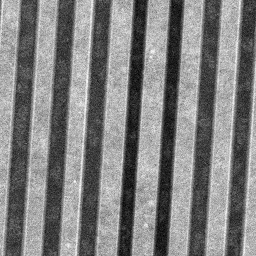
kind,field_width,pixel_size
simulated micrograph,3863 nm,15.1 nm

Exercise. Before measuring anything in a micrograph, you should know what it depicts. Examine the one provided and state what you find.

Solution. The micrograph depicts parallel lines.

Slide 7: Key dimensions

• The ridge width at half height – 0.299 microns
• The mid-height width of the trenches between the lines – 17.2 pixels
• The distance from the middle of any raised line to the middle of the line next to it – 552 nm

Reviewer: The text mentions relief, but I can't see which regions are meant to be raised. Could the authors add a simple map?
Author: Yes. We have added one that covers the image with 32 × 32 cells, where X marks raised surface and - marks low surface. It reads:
XX---XX--XXX--XXX--XX--XX---XX--
XX---XX--XXX--XXX-XXX--XX---XX--
XX---XX--XXX--XXX-XXX--XX---XX--
XX---XX--XX---XXX-XXX--XX---XX--
XX---XX--XX---XX--XXX--XX--XXX--
XX---XX--XX---XX--XXX--XX--XXX--
XX---XX--XX---XX--XXX--XX--XXX--
XX--XXX--XX---XX--XXX--XX--XXX--
XX--XXX--XX--XXX--XXX--XX--XXX--
XX--XXX--XX--XXX--XXX-XXX--XXX--
XX--XX---XX--XXX--XXX-XXX--XX---
XX--XX---XX--XXX--XX--XXX--XX---
XX--XX---XX--XXX--XX--XXX--XX---
XX--XX---XX--XXX--XX--XXX--XX---
XX--XX---XX--XXX--XX--XXX--XX--X
XX--XX--XXX--XXX--XX--XXX--XX--X
X---XX--XXX--XXX-XXX--XX---XX--X
X---XX--XXX--XXX-XXX--XX---XX--X
X---XX--XX---XXX-XXX--XX---XX--X
X---XX--XX---XXX-XXX--XX--XXX--X
X---XX--XX---XX--XXX--XX--XXX--X
X---XX--XX---XX--XXX--XX--XXX--X
X---XX--XX---XX--XXX--XX--XXX--X
X--XXX--XX---XX--XXX--XX--XXX--X
X--XXX--XX--XXX--XXX--XX--XXX--X
X--XXX--XX--XXX--XXX-XXX--XXX--X
X--XX---XX--XXX--XX--XXX--XX---X
X--XX---XX--XXX--XX--XXX--XX---X
X--XX---XX--XXX--XX--XXX--XX---X
X--XX---XX--XXX--XX--XXX--XX--XX
X--XX---XX--XXX-XXX--XXX--XX--XX
---XX--XXX--XXX-XXX--XX---XX--XX